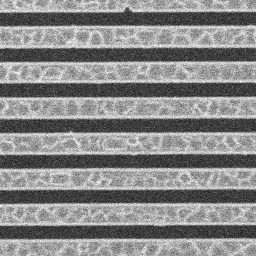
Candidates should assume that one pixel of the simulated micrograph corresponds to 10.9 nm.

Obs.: parallel lines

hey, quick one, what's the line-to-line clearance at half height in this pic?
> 0.172 micrometres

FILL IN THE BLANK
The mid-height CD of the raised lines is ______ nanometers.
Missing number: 212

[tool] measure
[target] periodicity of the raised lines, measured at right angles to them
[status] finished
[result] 385 nanometres